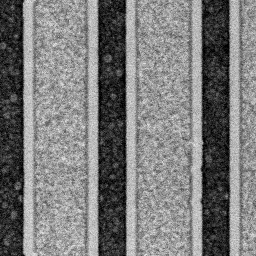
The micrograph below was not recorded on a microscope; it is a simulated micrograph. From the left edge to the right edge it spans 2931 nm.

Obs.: one or a few lines or trenches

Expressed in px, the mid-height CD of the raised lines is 67.6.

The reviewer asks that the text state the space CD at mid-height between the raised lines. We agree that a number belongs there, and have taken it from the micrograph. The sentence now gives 0.404 um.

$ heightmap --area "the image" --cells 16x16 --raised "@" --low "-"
--@@@@--@@@@---@
--@@@@--@@@@---@
--@@@@--@@@@---@
--@@@@--@@@@---@
--@@@@--@@@@---@
--@@@@--@@@@---@
--@@@@--@@@@---@
--@@@@--@@@@---@
--@@@@--@@@@---@
--@@@@--@@@@---@
--@@@@--@@@@---@
--@@@@--@@@@---@
--@@@@--@@@@---@
--@@@@--@@@@---@
--@@@@--@@@@---@
--@@@@--@@@@---@